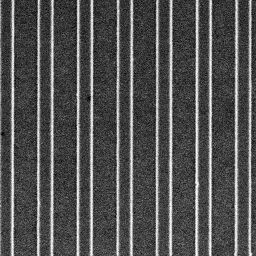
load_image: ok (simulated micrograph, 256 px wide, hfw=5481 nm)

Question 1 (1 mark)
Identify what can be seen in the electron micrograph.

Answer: parallel lines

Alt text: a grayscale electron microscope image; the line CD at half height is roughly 321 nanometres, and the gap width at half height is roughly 522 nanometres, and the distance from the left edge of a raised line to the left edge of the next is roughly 39.6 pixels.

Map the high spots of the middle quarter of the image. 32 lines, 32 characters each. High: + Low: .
...++++......++++......++++.....
...++++......++++......++++.....
...++++......++++......++++.....
...++++......++++......++++.....
...++++......++++......++++.....
...++++......++++......++++.....
...++++......++++......++++.....
...++++......++++......++++.....
...++++......++++......++++.....
...++++......++++......++++.....
...++++......++++......++++.....
...++++......++++......++++.....
...++++......++++......++++.....
...++++......++++......++++.....
...++++......++++......++++.....
...++++......++++......++++.....
...++++......++++......++++.....
...++++......++++......++++.....
...++++......++++......++++.....
...++++......++++......++++.....
...++++......++++......++++.....
...++++......++++......++++.....
...++++......++++......++++.....
...++++......++++......++++.....
...++++......++++......++++.....
...++++......++++......++++.....
...++++......++++......++++.....
...++++......++++......++++.....
....+++......++++......++++.....
...++++......++++......++++.....
...++++......++++......++++.....
...++++......++++......++++.....